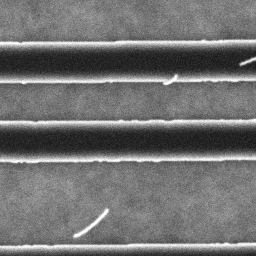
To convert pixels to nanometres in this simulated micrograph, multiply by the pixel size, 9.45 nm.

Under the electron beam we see lines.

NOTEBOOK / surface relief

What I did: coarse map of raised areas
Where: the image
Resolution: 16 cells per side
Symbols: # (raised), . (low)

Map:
................
................
................
################
################
................
................
.............#.#
################
################
................
................
................
................
................
################